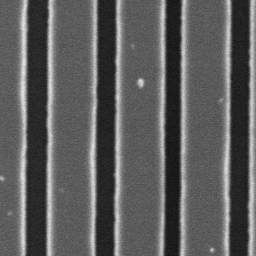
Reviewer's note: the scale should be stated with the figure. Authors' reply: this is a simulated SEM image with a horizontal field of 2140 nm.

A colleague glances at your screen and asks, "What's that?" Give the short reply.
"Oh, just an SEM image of lines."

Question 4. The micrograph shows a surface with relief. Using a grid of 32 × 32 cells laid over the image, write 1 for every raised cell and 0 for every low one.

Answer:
11100011111100011111100111111001
11100011111100011111100111111001
11100011111100011111100111111001
11100011111100011111100111111001
11100011111100011111100111111001
11100011111100011111100111111001
11100011111100011111100111111001
11100011111100011111100111111001
11100011111100011111100111111001
11100011111100011111100111111001
11100011111100011111100111111001
11100011111100011111100111111001
11100011111100011111100111111001
11100011111100011111100111111001
11100011111100011111000111111001
11100011111100011111100111111001
11100011111100011111100111111001
11100011111100011111100111111001
11100011111100011111100111111001
11100011111100011111100111111001
11100011111100011111100111111001
11100011111100011111100111110001
11100011111100011111100111110001
11100011111100011111100111110001
11100011111100111111100111111001
11100011111100111111100111111001
11100011111100111111000111111001
11100011111100111111000111111001
11100011111100111111000111111001
11100011111100111111000111110001
11100011111100111111000111110001
11100011111100111111000111110001